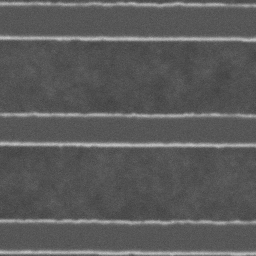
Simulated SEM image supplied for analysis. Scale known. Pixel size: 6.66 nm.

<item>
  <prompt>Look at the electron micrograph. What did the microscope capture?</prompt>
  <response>lines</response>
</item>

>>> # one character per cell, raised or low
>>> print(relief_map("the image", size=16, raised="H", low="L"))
HHHHHHHHHHHHHHHH
HHHHHHHHHHHHHHHH
LLLLLLLLLLLLLLLH
LLLLLLLLLLLLLLLL
LLLLLLLLLLLLLLLL
LLLLLLLLLLLLLLLL
LLLLLLLLLLLLLLLL
HHHHHHHHHHHHHHHH
HHHHHHHHHHHHHHHH
LLLLLLLLLLLLLLLL
LLLLLLLLLLLLLLLL
LLLLLLLLLLLLLLLL
LLLLLLLLLLLLLLLL
LLLLLLLLLLLLLLLL
HHHHHHHHHHHHHHHH
HHHHHHHHHHHHHHHH